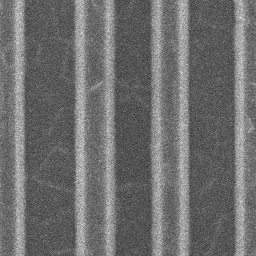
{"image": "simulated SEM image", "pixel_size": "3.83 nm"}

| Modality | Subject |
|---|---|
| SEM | one or a few lines or trenches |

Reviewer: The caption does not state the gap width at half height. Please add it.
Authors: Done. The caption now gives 203 nanometres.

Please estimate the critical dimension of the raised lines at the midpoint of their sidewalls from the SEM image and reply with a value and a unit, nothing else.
119 nm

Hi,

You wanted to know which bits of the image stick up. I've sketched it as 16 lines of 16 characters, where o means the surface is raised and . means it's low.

o....oo...oo...o
o....oo...oo...o
o....oo...oo...o
o....oo...oo...o
o....oo...oo...o
o....oo...oo...o
o....oo...oo...o
o....oo...oo...o
o....oo...oo...o
o....oo...oo...o
o....oo...oo...o
o....oo...oo...o
o....oo...oo...o
o....oo...oo...o
o....oo...oo...o
o....oo...oo...o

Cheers